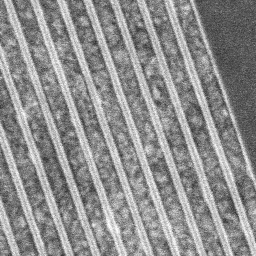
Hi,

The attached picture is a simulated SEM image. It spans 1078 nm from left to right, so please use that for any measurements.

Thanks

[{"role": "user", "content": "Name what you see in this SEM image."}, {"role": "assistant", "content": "parallel lines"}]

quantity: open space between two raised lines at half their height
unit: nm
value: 78.5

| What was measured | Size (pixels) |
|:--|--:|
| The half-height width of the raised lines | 5.91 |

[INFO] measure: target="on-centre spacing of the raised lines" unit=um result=0.106